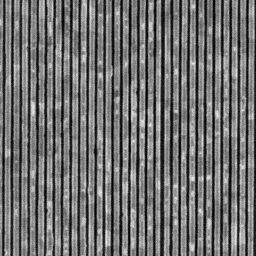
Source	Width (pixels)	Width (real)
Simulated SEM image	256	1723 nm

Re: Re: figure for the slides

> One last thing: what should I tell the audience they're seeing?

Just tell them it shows parallel lines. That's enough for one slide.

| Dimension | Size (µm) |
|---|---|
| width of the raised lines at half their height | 0.0328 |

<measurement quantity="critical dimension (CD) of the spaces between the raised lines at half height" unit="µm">0.0261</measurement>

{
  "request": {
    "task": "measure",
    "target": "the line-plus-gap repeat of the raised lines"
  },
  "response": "0.0564 µm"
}